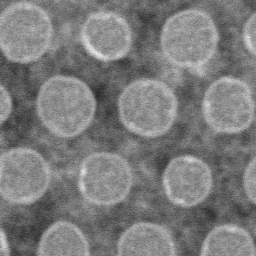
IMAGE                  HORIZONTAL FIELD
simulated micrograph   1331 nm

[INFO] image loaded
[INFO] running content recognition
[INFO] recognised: raised bodies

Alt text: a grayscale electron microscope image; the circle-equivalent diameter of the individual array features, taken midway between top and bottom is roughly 255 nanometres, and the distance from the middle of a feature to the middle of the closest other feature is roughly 427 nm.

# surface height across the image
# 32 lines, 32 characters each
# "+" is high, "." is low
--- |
................................
.++++...........................
++++++.....++++......+++++.....+
++++++.....+++.+.....++++++....+
++++++....++++++....+++++++.....
++++++........++....+++..++.....
.++++.........+......+++++......
......................++++......
................................
................................
......++++.......+++.......+++..
.....++++++.....+++++.....+++++.
+....+++++++...+++++++....+++++.
+....+++++++...+++++++....+++++.
+....++++++....+++++++....+++++.
......+++++.....+++++.....+++++.
.......+++.......+++............
................................
................................
.++++.......++..................
+++++......++++.......+++.......
++++++.....+++++.....+++++.....+
++++++....++++++.....+++++.....+
+++++.....++++++.....+++++.....+
.++++......++++......+.++......+
................................
................................
................................
.......++........+++........+...
.......+++......+++++.....+++++.
.....++++++....++++++.....+++++.
+....++++++....++++++.....++++++